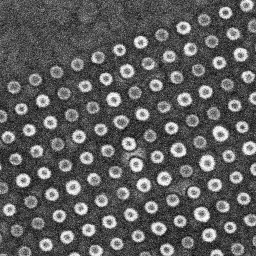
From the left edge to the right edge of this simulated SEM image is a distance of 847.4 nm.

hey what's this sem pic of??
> a regular array of raised bodies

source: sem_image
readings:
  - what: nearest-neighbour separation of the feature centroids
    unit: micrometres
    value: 0.0734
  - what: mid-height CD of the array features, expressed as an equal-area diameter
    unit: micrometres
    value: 0.0401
